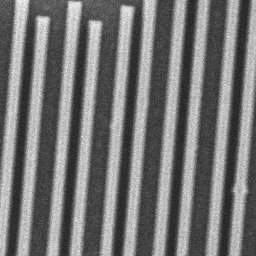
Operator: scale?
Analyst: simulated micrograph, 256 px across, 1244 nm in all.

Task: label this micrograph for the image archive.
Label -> parallel lines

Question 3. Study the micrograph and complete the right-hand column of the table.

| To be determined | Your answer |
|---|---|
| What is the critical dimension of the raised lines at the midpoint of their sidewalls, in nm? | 51.4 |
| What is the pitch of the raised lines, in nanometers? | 127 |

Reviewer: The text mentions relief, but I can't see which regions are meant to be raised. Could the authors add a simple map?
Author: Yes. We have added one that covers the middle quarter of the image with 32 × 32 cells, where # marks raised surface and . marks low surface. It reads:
###...##.....###...##......##...
##....##......##...##......##...
##...###.....###...##......##...
##...###.....###...##.....###...
##...###.....##....##.....###...
##...###.....##...###.....###...
##...###.....##...###.....###...
##...##......##...###.....###...
##...##......##...###.....##....
##...##......##...###.....##...#
##...##.....###...###.....##...#
##...##.....###...##......##...#
#....##.....###...##......##...#
#....##.....###...##......##...#
#....##.....###...##.....###...#
#....##.....###...##.....###...#
#...###.....##....##.....###...#
#...###.....##...###.....###...#
#...###.....##...###.....###...#
#...##......##...###.....###...#
#...##......##...###.....##....#
#...##......##...###.....##...##
#...##......##...###.....##...##
#...##......##...##......##...##
....##......##...##......##...##
...###.....###...##......##...##
...###.....###...##.....###...##
...###.....##....##.....###...##
...###.....##...###.....###...##
...###.....##...###.....###...##
...##......##...###.....###...##
...##......##...###.....##....##